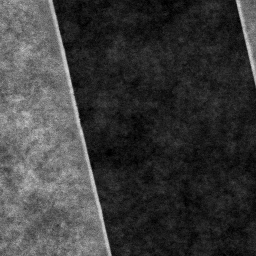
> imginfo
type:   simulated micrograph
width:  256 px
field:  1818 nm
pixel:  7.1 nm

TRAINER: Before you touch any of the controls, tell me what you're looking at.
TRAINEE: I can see one or a few lines or trenches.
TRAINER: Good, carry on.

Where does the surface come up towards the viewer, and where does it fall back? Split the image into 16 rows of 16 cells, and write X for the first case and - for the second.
XXX------------X
XXXX-----------X
XXXX-----------X
XXXX------------
XXXX------------
XXXX------------
XXXXX-----------
XXXXX-----------
XXXXX-----------
XXXXX-----------
XXXXXX----------
XXXXXX----------
XXXXXX----------
XXXXXX----------
XXXXXXX---------
XXXXXXX---------